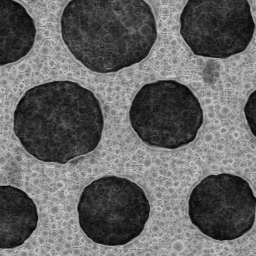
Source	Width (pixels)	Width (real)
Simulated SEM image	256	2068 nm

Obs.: holes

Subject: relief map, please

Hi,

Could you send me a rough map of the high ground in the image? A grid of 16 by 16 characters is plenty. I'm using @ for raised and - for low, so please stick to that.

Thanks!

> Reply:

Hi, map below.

-@@@-----@@-----
--@@------@-----
--@@------@@----
-@@@@----@@@@-@@
@@@@@@-@@@@@@@@@
@@---@@@@---@@@@
@-----@@----@@@-
@-----@@-----@@-
@-----@@@---@@@@
@@----@@@@@@@@@@
@@@@@@@@@@@@@@@@
@@@@@@--@@@@---@
--@@@----@@@----
--@@@----@@@----
--@@@----@@@@--@
-@@@@@@@@@@@@@@@